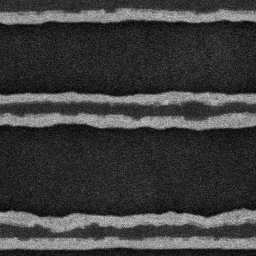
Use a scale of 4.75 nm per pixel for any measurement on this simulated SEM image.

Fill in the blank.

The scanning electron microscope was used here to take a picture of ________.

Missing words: one or a few lines or trenches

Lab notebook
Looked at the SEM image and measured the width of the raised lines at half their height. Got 119 nm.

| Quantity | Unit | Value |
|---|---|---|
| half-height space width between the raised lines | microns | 0.421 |